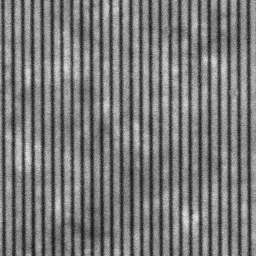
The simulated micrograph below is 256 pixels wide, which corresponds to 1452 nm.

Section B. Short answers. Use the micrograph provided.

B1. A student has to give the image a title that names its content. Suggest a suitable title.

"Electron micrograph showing parallel lines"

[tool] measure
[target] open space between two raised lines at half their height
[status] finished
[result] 22.7 nm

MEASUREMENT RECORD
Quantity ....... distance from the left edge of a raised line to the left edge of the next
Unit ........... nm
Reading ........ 55.7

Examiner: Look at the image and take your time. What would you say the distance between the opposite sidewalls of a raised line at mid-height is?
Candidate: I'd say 0.0333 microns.